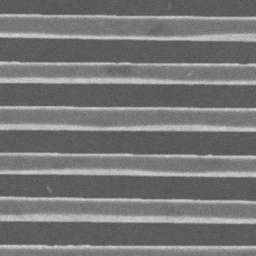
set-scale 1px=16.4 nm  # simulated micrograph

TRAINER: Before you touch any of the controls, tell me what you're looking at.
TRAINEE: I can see lines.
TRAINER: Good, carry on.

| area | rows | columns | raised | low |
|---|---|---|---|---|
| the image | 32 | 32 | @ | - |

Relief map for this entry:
--------------------------------
--------------------------------
@@@@@@@@@@@@@@@@@@@@@@@@@@@@@@@@
@@@@@@@@@@@@@@@@@@@@@@@@@@@@@@@@
-@@@@@@@@@@@@@@@@@@@@@@@@@@@@@@@
--------------------------------
--------------------------------
--------------------------------
@@@@@@@@@@@@@@@@@@@@@@@@@@@@@@@@
@@@@@@@@@@@@@@@@@@@@@@@@@@@@@@@@
--------------------------------
--------------------------------
--------------------------------
@@@@@@@@@@@@@@@@@@--------------
@@@@@@@@@@@@@@@@@@@@@@@@@@@@@@@@
@@@@@@@@@@@@@@@@@@@@@@@@@@@@@@@@
--------------------------------
--------------------------------
--------------------------------
@@@@@@@@@@@@@@@@@@@@@@@@@-------
@@@@@@@@@@@@@@@@@@@@@@@@@@@@@@@@
@@@@@@------@@@@@@@@@@@@@@@@@@@@
--------------------------------
--------------------------------
--------------------------------
@@@@@@@@@@@@@@@@@@@@@@@@@@@@@@@@
@@@@@@@@@@@@@@@@@@@@@@@@@@@@@@@@
------------------@@@@@@@@@@@@@@
--------------------------------
--------------------------------
--------------------------------
@@@@@@@@@@@@@@@@@@@@@@@@@@@@@@@@